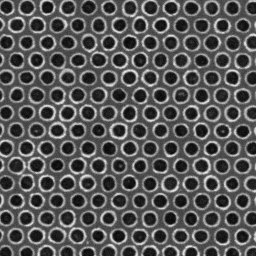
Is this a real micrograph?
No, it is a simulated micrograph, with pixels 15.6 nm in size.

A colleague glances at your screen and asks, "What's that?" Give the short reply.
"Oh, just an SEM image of a regular array of holes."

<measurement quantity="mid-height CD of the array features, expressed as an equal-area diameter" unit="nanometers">211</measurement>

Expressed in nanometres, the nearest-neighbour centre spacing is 311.